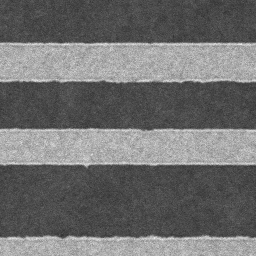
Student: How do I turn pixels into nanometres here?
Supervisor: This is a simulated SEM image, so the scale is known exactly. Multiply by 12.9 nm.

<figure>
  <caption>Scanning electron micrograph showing one or a few lines or trenches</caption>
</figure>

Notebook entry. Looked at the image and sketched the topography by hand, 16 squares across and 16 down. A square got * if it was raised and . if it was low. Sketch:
................
................
................
****************
****************
................
................
................
****************
****************
................
................
................
................
................
****************